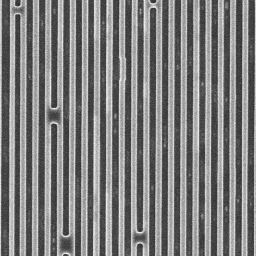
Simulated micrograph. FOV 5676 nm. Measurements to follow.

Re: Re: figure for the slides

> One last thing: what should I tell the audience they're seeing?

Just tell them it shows parallel lines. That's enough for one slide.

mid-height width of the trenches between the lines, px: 6.75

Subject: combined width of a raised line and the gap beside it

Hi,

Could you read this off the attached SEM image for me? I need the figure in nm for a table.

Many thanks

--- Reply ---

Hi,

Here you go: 272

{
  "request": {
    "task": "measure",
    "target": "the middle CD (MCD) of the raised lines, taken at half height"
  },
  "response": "128 nanometres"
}